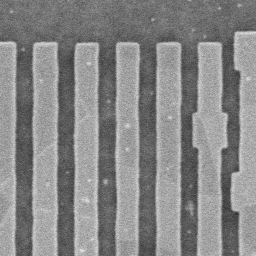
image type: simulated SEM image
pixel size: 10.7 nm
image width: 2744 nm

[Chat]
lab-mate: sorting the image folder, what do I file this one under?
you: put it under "wiring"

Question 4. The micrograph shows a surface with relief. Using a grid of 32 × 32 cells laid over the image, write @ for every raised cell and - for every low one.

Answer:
--------------------------------
--------------------------------
--------------------------------
--------------------------------
-----------------------------@@@
@@---@@----@---@@---@@---@@--@@@
@@--@@@--@@@---@@---@@---@@@-@@@
@@--@@@--@@@---@@---@@---@@@-@@@
@@--@@@--@@@---@@---@@---@@@-@@@
@@--@@@--@@@---@@---@@---@@@--@@
@@--@@@--@@@---@@---@@---@@@--@@
@@--@@@--@@@---@@---@@@--@@@--@@
@@--@@@--@@@---@@---@@@--@@@--@@
@@--@@@--@@@---@@---@@---@@@--@@
@@--@@@--@@@---@@---@@--@@@@--@@
@@--@@@--@@@---@@---@@--@@@@--@@
@@--@@@--@@@---@@---@@--@@@@--@@
@@--@@@--@@@---@@---@@--@@@@--@@
@@--@@@--@@@---@@---@@--@@@@--@@
@@--@@@--@@@---@@---@@---@@@--@@
@@--@@@--@@@---@@---@@---@@@--@@
@@--@@@--@@@---@@---@@---@@@--@@
@@--@@@--@@@---@@---@@---@@--@@@
@@--@@@--@@@---@@---@@---@@@-@@@
@@--@@@--@@@---@@---@@---@@@-@@@
@@--@@@--@@@---@@---@@---@@@-@@@
@@--@@@--@@@---@@---@@---@@@--@@
@@--@@@--@@@---@@---@@---@@@--@@
@@--@@@--@@@---@@---@@---@@@--@@
@@--@@@--@@@---@@---@@---@@@--@@
@@--@@@--@@@---@@---@@---@@@--@@
@@--@@@--@@@---@@---@@---@@@--@@